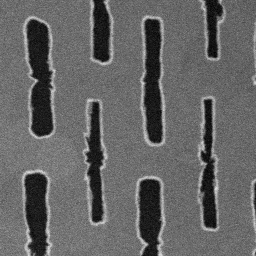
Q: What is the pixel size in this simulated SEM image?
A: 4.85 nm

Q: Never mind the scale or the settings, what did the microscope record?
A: holes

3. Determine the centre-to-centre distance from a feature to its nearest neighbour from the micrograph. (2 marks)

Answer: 100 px